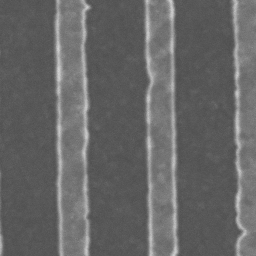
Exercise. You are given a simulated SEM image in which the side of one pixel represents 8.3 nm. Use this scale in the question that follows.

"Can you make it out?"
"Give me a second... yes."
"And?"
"one or a few lines or trenches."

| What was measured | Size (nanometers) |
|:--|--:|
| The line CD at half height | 214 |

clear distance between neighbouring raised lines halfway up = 527 nanometres